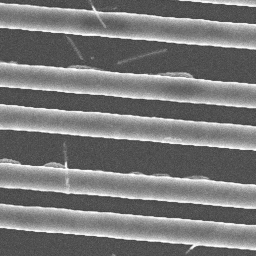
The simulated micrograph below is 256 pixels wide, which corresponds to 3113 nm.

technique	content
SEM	lines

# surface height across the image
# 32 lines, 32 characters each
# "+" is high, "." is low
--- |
+...........................++++
++++++++++++....................
++++++++++++++++++++++++++......
.+++++++++++++++++++++++++++++++
............++++++++++++++++++++
.........................+++++++
................................
................................
+++++++.........................
+++++++++++++++++++++...........
+++++++++++++++++++++++++++++++.
........++++++++++++++++++++++++
.....................+++++++++++
+++++...........................
+++++++++++++++++...............
++++++++++++++++++++++++++++....
......++++++++++++++++++++++++++
.................+++++++++++++++
............................++++
................................
++..............................
+++++++++++++...................
++++++++++++++++++++++++........
..++++++++++++++++++++++++++++++
..............++++++++++++++++++
.........................+++++++
+++++++++++.....................
++++++++++++++++++++++++........
.+++++++++++++++++++++++++++++++
............++++++++++++++++++++
........................++++++++
................................